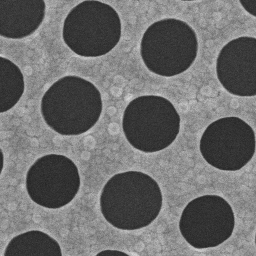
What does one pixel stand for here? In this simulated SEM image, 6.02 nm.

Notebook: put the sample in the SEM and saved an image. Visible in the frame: holes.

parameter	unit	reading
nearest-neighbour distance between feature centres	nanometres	471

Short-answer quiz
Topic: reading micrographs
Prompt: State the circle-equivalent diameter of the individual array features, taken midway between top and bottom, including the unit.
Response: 346 nm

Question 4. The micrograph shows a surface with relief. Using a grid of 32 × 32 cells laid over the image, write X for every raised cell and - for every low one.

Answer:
------XXXX---XXXXXXXXXXXXXXXXX--
------XXX------XXXXXXXXXXXXXXXX-
-----XXX-------XXXXX--XXXXXXXXXX
-----XXX-------XXXX-----XXXXXXXX
---XXXXX-------XXX------XXXXXXXX
XXXXXXXX-------XXX-------XXX----
XXXXXXXXX-----XXXX-------XX-----
-XXXXXXXXXXXXXXXXX------XXX-----
--XXXXXXXXXXXXXXXX-----XXXX-----
---XXXXXXXXXXXXXXXXX-XXXXXX-----
---XXXX-----XXXXXXXXXXXXXXXX----
---XXX------XXXXXXXXXXXXXXXXX---
--XXX--------XXXX----XXXXXXXXXXX
-XXXX--------XXX------XXXXXXXXXX
XXXXX-------XXX-------XXXXXXXXXX
XXXXXX------XXX-------XXXX-----X
XXXXXXX----XXXX-------XXXX------
XXXXXXXXXXXXXXXX------XXX-------
XXXXXXXXXXXXXXXXX----XXXX-------
XXXXXX--XXXXXXXXXXXXXXXXX-------
XXXX-----XXXXXXXXXXXXXXXXX-----X
XXX-------XXXXXX--XXXXXXXXXXXXXX
XXX-------XXXX-----XXXXXXXXXXXXX
XXX-------XXX-------XXXXXXXXXXXX
XXXX-----XXXX-------XXXXX--XXXXX
XXXXX---XXXXX-------XXX------XXX
XXXXXXXXXXXXX-------XXX------XXX
XXXXXXXXXXXXX------XXX-------XXX
XXXXXXXXXXXXXXX---XXXX-------XXX
XX----XXXXXXXXXXXXXXXXX------XXX
X------XXXXXXXXXXXXXXXXX----XXXX
X-------XXXXX--XXXXXXXXXXXXXXXXX